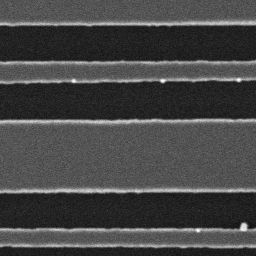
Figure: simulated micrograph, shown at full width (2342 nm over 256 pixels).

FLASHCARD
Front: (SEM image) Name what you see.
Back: lines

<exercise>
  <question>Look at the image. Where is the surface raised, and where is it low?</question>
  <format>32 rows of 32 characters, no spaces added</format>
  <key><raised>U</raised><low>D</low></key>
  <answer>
UUUUUUUUUUUUUUUUUUUUUUUUUUUUUUUU
UUUUUUUUUUUUUUUUUUUUUUUUUUUUUUUU
UUUUUUUUUUUUUUUUUUUUUUUUUUUUUUUU
DDDDDDDDDDDDDDDDDDDDDDDDDDDDDDDD
DDDDDDDDDDDDDDDDDDDDDDDDDDDDDDDD
DDDDDDDDDDDDDDDDDDDDDDDDDDDDDDDD
DDDDDDDDDDDDDDDDDDDDDDDDDDDDDDDD
DDDDDDDDDDDDDDDDDDDDDDDDDDDDDDDD
UUUUUUUUUUUUUUUUUUUUUUUUUUUUUUUU
UUUUUUUUUUUUUUUUUUUUUUUUUUUUUUUU
DDDDDDDDDDDDDDDDDDDDDDDDDDDDDDDD
DDDDDDDDDDDDDDDDDDDDDDDDDDDDDDDD
DDDDDDDDDDDDDDDDDDDDDDDDDDDDDDDD
DDDDDDDDDDDDDDDDDDDDDDDDDDDDDDDD
DDDDDDDDDDDDDDDDDDDDDDDDDDDDDDDD
UUUUUUUUUUUUUUUUUUUUUUUUUUUUUUUU
UUUUUUUUUUUUUUUUUUUUUUUUUUUUUUUU
UUUUUUUUUUUUUUUUUUUUUUUUUUUUUUUU
UUUUUUUUUUUUUUUUUUUUUUUUUUUUUUUU
UUUUUUUUUUUUUUUUUUUUUUUUUUUUUUUU
UUUUUUUUUUUUUUUUUUUUUUUUUUUUUUUU
UUUUUUUUUUUUUUUUUUUUUUUUUUUUUUUU
UUUUUUUUUUUUUUUUUUUUUUUUUUUUUUUU
UUUUUUUUUUUUUUUUUUUUUUUUUUUUUUUU
DDDDDDDDDDDDDDDDDDDDDDDDDDDDDDDD
DDDDDDDDDDDDDDDDDDDDDDDDDDDDDDDD
DDDDDDDDDDDDDDDDDDDDDDDDDDDDDDDD
DDDDDDDDDDDDDDDDDDDDDDDDDDDDDDDD
DDDDDDDDDDDDDDDDDDDDDDDDDDDDDDUD
UUUUUUUUUUUUUUUUUUUUUUUUUUUUUUUU
UUUUUUUUUUUUUUUUUUUUUUUUUUUUUUUU
DDDDDDDDDDDDDDDDDDDDDDDDDDDDDDDD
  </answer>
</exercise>